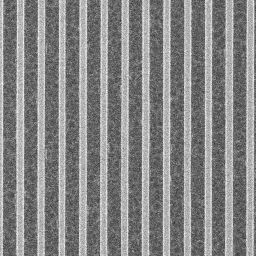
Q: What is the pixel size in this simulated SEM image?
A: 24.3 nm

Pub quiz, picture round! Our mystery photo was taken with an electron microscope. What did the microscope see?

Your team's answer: parallel lines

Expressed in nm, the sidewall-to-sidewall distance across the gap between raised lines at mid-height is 352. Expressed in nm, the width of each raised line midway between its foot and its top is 158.